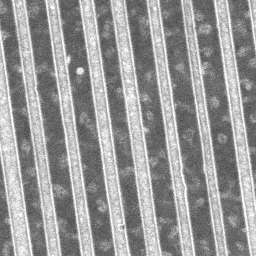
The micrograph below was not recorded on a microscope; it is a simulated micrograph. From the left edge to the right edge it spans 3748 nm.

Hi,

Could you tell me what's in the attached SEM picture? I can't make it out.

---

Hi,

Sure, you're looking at parallel lines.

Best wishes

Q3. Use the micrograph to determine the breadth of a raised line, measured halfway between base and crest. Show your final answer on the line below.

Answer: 344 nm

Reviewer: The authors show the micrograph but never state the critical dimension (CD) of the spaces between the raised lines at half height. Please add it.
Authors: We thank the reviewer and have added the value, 160 nanometres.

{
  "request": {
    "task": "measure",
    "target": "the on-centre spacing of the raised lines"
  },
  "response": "0.481 µm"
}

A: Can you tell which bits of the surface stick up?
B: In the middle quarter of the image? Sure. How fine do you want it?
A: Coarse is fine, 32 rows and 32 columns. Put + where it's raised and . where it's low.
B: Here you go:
.+++++...+++++....+++++...++++++
.++++++...++++....+++++...++++++
.++++++...++++....+++++...++++++
.++++++...+++++...++++++..++++++
.++++++...+++++...++++++..++++++
.++++++...+++++...++++++..++++++
.++++++...+++++...++++++...+++++
..+++++....++++...++++++...+++++
..++++++...++++...++++++...+++++
..++++++...++++....+++++...+++++
..++++++...+++++...++++++..+++++
..++++++...+++++...++++++..+++++
..++++++...+++++...++++++..+++++
..++++++...+++++...++++++...++++
...+++++....++++...++++++...++++
...++++++...++++...++++++...++++
...++++++...++++....+++++...++++
...++++++...+++++...++++++..++++
+..++++++...+++++...++++++..++++
+..++++++...+++++...++++++..++++
+..++++++...+++++...++++++...+++
+...+++++...+++++....+++++...+++
+...++++++..+++++...++++++...+++
+...++++++...++++....+++++...+++
+...++++++...+++++...++++++..+++
++..++++++...+++++...++++++..+++
++..++++++...+++++...++++++..+++
++..++++++...+++++...++++++..+++
++...+++++...+++++....+++++...++
++...++++++..+++++....+++++...++
++...++++++...++++....+++++...++
++...++++++...+++++...++++++..++